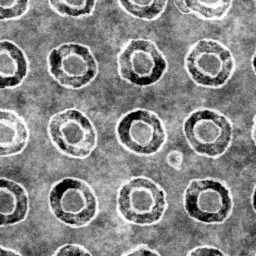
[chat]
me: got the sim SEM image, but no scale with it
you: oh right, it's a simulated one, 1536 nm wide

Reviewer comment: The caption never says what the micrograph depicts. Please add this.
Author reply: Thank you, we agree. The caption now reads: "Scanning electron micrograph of a regular array of ring-shaped grooves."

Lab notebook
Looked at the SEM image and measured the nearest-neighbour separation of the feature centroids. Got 410 nanometres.